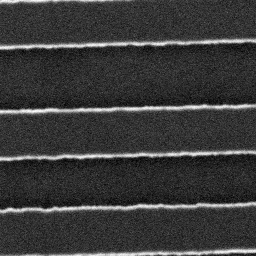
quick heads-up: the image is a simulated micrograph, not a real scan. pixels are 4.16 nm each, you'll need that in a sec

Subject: lines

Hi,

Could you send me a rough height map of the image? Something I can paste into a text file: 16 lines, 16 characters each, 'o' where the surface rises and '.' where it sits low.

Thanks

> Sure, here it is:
oooooooooooooooo
oooooooooooooooo
oooooooooooooooo
................
................
................
................
oooooooooooooooo
oooooooooooooooo
oooooooooooooooo
................
................
................
oooooooooooooooo
oooooooooooooooo
oooooooooooooooo